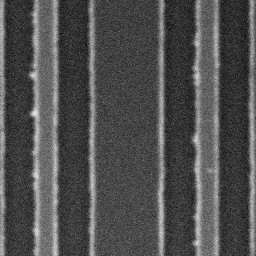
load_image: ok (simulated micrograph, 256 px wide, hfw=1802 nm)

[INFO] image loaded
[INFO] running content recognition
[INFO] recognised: lines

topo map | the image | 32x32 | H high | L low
LLLLHHHLLLLHHHHHHHHHLLLLLHHLLLLH
LLLLHHHLLLLHHHHHHHHHLLLLLHHLLLLH
LLLLHHHLLLLHHHHHHHHHLLLLLHHLLLLH
LLLLHHHLLLLHHHHHHHHHLLLLLHHLLLLH
LLLLHHHLLLLHHHHHHHHHLLLLLHHLLLLH
LLLLHHHLLLLHHHHHHHHHLLLLLHHLLLLL
LLLLHHHLLLLHHHHHHHHHLLLLLHHLLLLH
LLLLHHHLLLLHHHHHHHHHLLLLLHHLLLLH
LLLLHHHLLLLHHHHHHHHHLLLLLHHLLLLH
LLLLHHHLLLLHHHHHHHHHLLLLLHHLLLLH
LLLLHHHLLLLHHHHHHHHHLLLLLHHLLLLH
LLLLHHHLLLLHHHHHHHHHLLLLLHHLLLLH
LLLLHHHLLLLLHHHHHHHHLLLLLHHLLLLH
LLLLHHHLLLLHHHHHHHHHLLLLLHHLLLLH
LLLLHHHLLLLHHHHHHHHHLLLLLHHLLLLH
LLLLLHHLLLLHHHHHHHHHLLLLLHHLLLLH
LLLLLHHLLLLHHHHHHHHHLLLLLHHLLLLH
LLLLLHHLLLLHHHHHHHHHLLLLLHHLLLLH
LLLLHHHLLLLHHHHHHHHHLLLLLHHLLLLH
LLLLHHHLLLLHHHHHHHHHLLLLLHHLLLLH
LLLLHHHLLLLHHHHHHHHHLLLLLHHLLLLL
LLLLHHHLLLLLHHHHHHHHLLLLLHHLLLLH
LLLLLHHLLLLLHHHHHHHHLLLLLHHLLLLL
LLLLLHHLLLLHHHHHHHHHLLLLLHHLLLLL
LLLLLHHLLLLLHHHHHHHHLLLLLHHLLLLL
LLLLLHHLLLLLHHHHHHHHLLLLLHHLLLLH
LLLLLHHLLLLHHHHHHHHHLLLLLHHLLLLH
LLLLHHHLLLLHHHHHHHHHLLLLLHHLLLLL
LLLLHHHLLLLHHHHHHHHHLLLLLHHLLLLH
LLLLLHHLLLLHHHHHHHHHLLLLLHHLLLLH
LLLLLHHLLLLHHHHHHHHHLLLLLHHLLLLH
LLLLLHHLLLLHHHHHHHHHLLLLLHHLLLLH